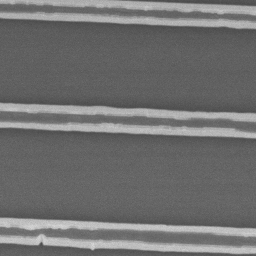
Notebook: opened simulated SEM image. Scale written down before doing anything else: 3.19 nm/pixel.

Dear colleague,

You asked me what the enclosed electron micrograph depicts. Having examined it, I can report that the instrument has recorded one or a few lines or trenches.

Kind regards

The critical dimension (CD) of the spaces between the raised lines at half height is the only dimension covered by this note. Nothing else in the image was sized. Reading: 298 nm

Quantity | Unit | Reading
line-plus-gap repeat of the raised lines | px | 113